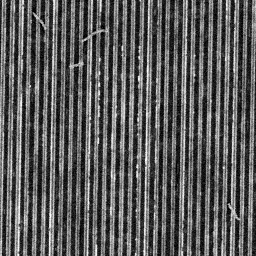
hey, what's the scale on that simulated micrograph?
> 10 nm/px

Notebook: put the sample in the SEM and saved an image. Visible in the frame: parallel lines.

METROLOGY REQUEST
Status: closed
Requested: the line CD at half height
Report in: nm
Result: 28.8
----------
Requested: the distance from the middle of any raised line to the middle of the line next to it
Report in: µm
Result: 0.0865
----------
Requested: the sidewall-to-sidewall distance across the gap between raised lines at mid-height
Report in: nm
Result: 56.4